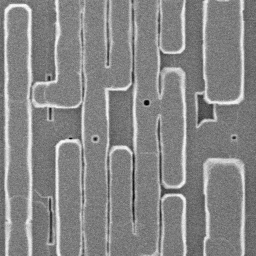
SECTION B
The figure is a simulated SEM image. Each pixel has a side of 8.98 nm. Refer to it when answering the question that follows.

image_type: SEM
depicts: wiring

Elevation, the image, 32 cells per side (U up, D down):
DDDDDDDUUUUUUUUUUUUUUUUDDDUUUUDD
DUUUDDDUUUUUUUUUUUUUUUUDDDUUUUDD
DUUUDDDUUUUUUUUUUUUUUUUDDDUUUUDD
DUUUDDDUUUUUUUUUDUUUUUUDDUUUUUDD
DUUUDDDUUUUUUUUUDUUUUUUDDUUUUUDD
DUUUDDDUUUUUUUUUUUUUUUUDDUUUUUDD
DUUUDDDUUUUUUUUUUUUUUUDDDUUUUUDD
DUUUDDDUUUUUUUUUUUUUDDDDDUUUUUDD
DUUUDDDUUUUUUUUUUUUUDDDDDUUUUUDD
DUUUDDDUUUUUUUUUUUUUUUUDDUUUUUDD
DUUUDUUUUUUUUUUUDUUUUUUDDDUUUUDD
DUUUUUUUUUUUUUDDDUUUUUUDDDUUUUDD
DUUUUUUUUUUUUDDDDUUUUUUDDDUUUUDD
DUUUDDDDDDUUUDDDDUUUUUUDDDDDDDDD
DUUUDDDDDDUUUUDDDUUUUUUDDDDDDDDD
DUUUDDDDDDUUUUDDDUUUUUUDDDDDDDDD
DUUUDDDDDDUUUUDDDUUUUUUDDDDDDDDD
DUUUDDDDDDUUUUDDDUUUUUUDDDDDDDDD
DUUUDDDUUUUUUUUUDUUUUUUDDDDDDDDD
DUUUDDDUUUUUUUUUUUUUUUUDDDDDDDDD
DUUUDDDUUUUUUUUUUUUUUUUDDDUUUUDD
DUUUDDDUUUUUUUUUUUUUUUUDDDUUUUDD
DUUUDDDUUUUUUUUUUUUUUUUDDDUUUUDD
DUUUDDDUUUUUUUUUUUUUDDDDDDUUUUDD
DUUUDDDUUUUUUUUUUUUUDUUDDDUUUUDD
DUUUDDDUUUUUUUUUUUUUUUUDDDUUUUDD
DUUUDDDUUUUUUUUUUUUUUUUDDDUUUUDD
DUUUDDDUUUUUUUUUUUUUUUUDDDUUUUDD
DUUUDDDUUUUUUUUUUUUUUUUDDDUUUUDD
DUUUDDDUUUUUUUUUUUUUUUUDDDUUUUDD
DUUUDDDUUUUUUUUUUUUUUUUDDDUUUUDD
DUUUDDDUUUUUUUUUUUUUUUUDDDUUUUDD